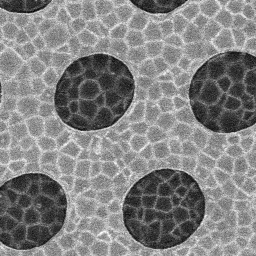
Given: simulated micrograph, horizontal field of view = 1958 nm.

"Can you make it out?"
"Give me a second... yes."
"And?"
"holes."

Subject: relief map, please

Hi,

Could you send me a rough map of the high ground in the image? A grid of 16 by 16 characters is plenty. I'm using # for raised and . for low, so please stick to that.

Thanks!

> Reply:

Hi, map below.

...######..#####
################
################
#####..######...
####....####....
###.....####....
###.....####....
####...#####....
################
################
################
....####....####
....####.....###
....####.....###
....####....####
#.#######..#####